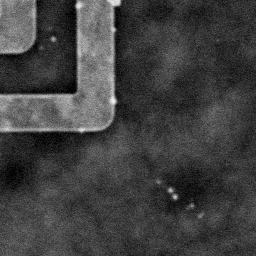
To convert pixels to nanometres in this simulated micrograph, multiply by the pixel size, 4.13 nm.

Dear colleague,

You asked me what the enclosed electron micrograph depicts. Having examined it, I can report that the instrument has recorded groups of lines, slits or small figures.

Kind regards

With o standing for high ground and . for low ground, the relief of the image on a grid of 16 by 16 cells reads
oo...oo.........
oo...oo.........
oo...oo.........
.....oo.........
.....oo.........
.....oo.........
ooooooo.........
ooooooo.........
................
................
................
................
................
................
................
................